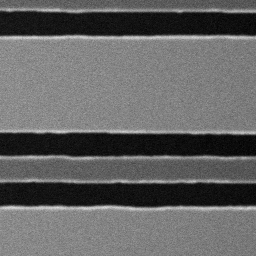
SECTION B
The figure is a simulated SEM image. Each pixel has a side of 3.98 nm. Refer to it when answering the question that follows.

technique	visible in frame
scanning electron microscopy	lines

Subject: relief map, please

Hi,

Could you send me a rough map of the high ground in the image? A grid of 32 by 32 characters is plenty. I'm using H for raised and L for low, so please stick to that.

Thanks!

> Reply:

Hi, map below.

HHHHHHHHHHHHHHHHHHHHHHHHHHHHHHHH
LLLLLLLLHHHLLLLLLLLLLLHLLLLLHHHH
LLLLLLLLLLLLLLLLLLLLLLLLLLLLLLLL
LLLLLLLLLLLLLLLLLLLLLLLLLLLLLLLL
LLLLLLLLLHLLLLLLLLLLLHHLLLLHHLLL
HHHHHHHHHHHHHHHHHHHHHHHHHHHHHHHH
HHHHHHHHHHHHHHHHHHHHHHHHHHHHHHHH
HHHHHHHHHHHHHHHHHHHHHHHHHHHHHHHH
HHHHHHHHHHHHHHHHHHHHHHHHHHHHHHHH
HHHHHHHHHHHHHHHHHHHHHHHHHHHHHHHH
HHHHHHHHHHHHHHHHHHHHHHHHHHHHHHHH
HHHHHHHHHHHHHHHHHHHHHHHHHHHHHHHH
HHHHHHHHHHHHHHHHHHHHHHHHHHHHHHHH
HHHHHHHHHHHHHHHHHHHHHHHHHHHHHHHH
HHHHHHHHHHHHHHHHHHHHHHHHHHHHHHHH
HHHHHHHHHHHHHHHHHHHHHHHHHHHHHHHH
LHLLHHHHHLLLLHHHHHHHHHHHHHHHHHHH
LLLLLLLLLLLLLLLLLLLLLLLLLLLLLLLL
LLLLLLLLLLLLLLLLLLLLLLLLLLLLLLLL
LLLLLLLLLLLLLLLLLLLLLLLLLLLLLLLL
HHHHHHHHHHHHHHHHHHHHHHHHHHHHHHHH
HHHHHHHHHHHHHHHHHHHHHHHHHHHHHHHH
HHHHHHHHHHHHHHHHHHHHHHHHHHHHHHHH
LLLLLLLLLLLLLLLLLLLLLLLLLLLLLLLL
LLLLLLLLLLLLLLLLLLLLLLLLLLLLLLLL
LLLLLLLLLLLLLLLLLLLLLLLLLLLLLLLL
HHHHHHHHHHHHHHHHHHHHHHHHHHHHHHHH
HHHHHHHHHHHHHHHHHHHHHHHHHHHHHHHH
HHHHHHHHHHHHHHHHHHHHHHHHHHHHHHHH
HHHHHHHHHHHHHHHHHHHHHHHHHHHHHHHH
HHHHHHHHHHHHHHHHHHHHHHHHHHHHHHHH
HHHHHHHHHHHHHHHHHHHHHHHHHHHHHHHH